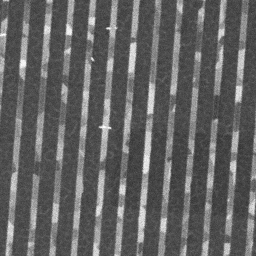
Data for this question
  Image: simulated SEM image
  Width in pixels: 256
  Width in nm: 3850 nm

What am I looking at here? parallel lines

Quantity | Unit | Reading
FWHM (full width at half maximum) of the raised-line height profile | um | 0.0824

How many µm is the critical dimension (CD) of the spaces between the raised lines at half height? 0.247